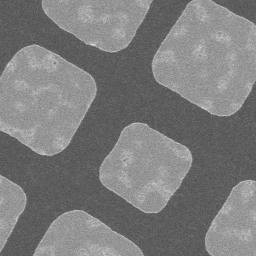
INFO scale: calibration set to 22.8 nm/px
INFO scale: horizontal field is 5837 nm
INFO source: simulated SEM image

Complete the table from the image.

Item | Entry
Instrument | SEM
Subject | raised bodies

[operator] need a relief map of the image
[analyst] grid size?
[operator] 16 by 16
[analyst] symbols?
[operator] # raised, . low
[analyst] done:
...######...##..
....#####..#####
.....###..######
.###......######
#####.....######
######.....#####
######......###.
#####...........
.####...##......
..##...#####....
......######....
#......####....#
##......###...##
#...##........##
#..####......###
..#######....###